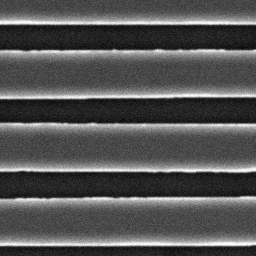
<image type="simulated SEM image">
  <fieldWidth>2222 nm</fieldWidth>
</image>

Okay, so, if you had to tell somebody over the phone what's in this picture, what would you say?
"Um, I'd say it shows lines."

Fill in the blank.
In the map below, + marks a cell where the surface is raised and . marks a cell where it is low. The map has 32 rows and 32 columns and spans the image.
++++++++++++++++++++++++++++++++
++++++++++++++++++++++++++++++++
++++++++++++++++++++++++++++++++
................................
................................
................................
++++++++++++++++++++++++++++++++
++++++++++++++++++++++++++++++++
++++++++++++++++++++++++++++++++
++++++++++++++++++++++++++++++++
++++++++++++++++++++++++++++++++
++++++++++++++++++++++++++++++++
................................
................................
................................
+++.+++....+....................
++++++++++++++++++++++++++++++++
++++++++++++++++++++++++++++++++
++++++++++++++++++++++++++++++++
++++++++++++++++++++++++++++++++
++++++++++++++++++++++++++++++++
................................
................................
................................
................................
++++++++++++++++++++++++++++++++
++++++++++++++++++++++++++++++++
++++++++++++++++++++++++++++++++
++++++++++++++++++++++++++++++++
++++++++++++++++++++++++++++++++
++++++++++++++++++++++++++++++++
................................